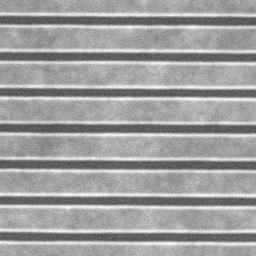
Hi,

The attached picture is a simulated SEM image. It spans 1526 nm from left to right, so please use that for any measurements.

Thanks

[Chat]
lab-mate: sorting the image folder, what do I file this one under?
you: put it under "parallel lines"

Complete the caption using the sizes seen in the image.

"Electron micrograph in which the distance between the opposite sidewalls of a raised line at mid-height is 0.15 um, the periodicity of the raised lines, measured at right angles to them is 215 nm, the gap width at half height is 64.8 nanometers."